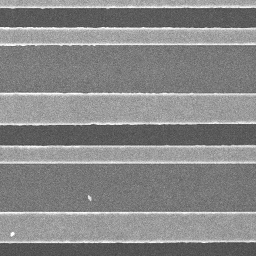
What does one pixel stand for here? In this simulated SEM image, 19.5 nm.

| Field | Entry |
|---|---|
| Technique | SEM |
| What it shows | lines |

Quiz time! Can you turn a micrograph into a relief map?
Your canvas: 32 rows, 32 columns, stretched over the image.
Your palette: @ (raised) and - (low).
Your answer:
@@@@@@@@@@@@@@@@@@@@@@@@@@@@@@@@
--------------------------------
--------------------------------
@@@@@@@@@@@@@@@@@@@@@@----@-----
@@@@@@@@@@@@@@@@@@@@@@@@@@@@@@@@
@@@@@@@@@@@@@@@@@@@@@@@@@@@@@@@@
--------------------------------
--------------------------------
--------------------------------
--------------------------------
--------------------------------
--------------------------------
@@@@@@@@@@@@@@@@@@@@@@@@@@@@@@@@
@@@@@@@@@@@@@@@@@@@@@@@@@@@@@@@@
@@@@@@@@@@@@@@@@@@@@@@@@@@@@@@@@
@@@@@@@@@@@@@@@@@@-@@@----------
--------------------------------
--------------------------------
@@@@@@@@@@@@@@@@@@@@@@@@@@@@@@@@
@@@@@@@@@@@@@@@@@@@@@@@@@@@@@@@@
--------------------------------
--------------------------------
--------------------------------
--------------------------------
--------------------------------
--------------------------------
--------------------------------
@@@@@@@@@@@@@@@@@@@@@@@@@@@@@@@@
@@@@@@@@@@@@@@@@@@@@@@@@@@@@@@@@
@@@@@@@@@@@@@@@@@@@@@@@@@@@@@@@@
--------------------------------
--------------------------------